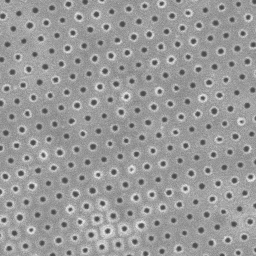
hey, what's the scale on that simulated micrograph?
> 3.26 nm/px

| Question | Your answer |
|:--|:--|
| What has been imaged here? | a regular array of holes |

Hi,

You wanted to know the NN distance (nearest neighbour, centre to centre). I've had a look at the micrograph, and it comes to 16.2 px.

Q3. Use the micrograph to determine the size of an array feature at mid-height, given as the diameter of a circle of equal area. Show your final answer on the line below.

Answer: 18.8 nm